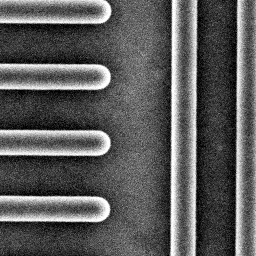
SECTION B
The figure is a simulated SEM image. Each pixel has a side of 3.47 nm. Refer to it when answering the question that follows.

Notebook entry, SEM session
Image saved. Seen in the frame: groups of lines, slits or small figures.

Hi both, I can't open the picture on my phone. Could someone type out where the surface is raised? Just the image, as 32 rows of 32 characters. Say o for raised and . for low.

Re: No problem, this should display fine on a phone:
oooooooooooooo........ooo.....oo
oooooooooooooo........ooo.....oo
ooooooooooooo.........ooo.....oo
......................ooo.....oo
......................ooo.....oo
......................ooo.....oo
......................ooo.....oo
......................ooo.....oo
ooooooooooooo.........ooo.....oo
oooooooooooooo........oo......oo
ooooooooooooo.........oo......oo
......................oo......oo
......................oo......oo
......................oo......oo
......................oo......oo
......................oo......oo
ooooooooooooo.........oo......oo
oooooooooooooo........oo......oo
oooooooooooooo........oo......oo
......................oo......oo
......................oo......oo
......................oo......oo
......................oo......oo
......................oo......oo
......................oo......oo
ooooooooooooo.........oo......oo
oooooooooooooo.......ooo......oo
ooooooooooooo........ooo......oo
.....................ooo......oo
.....................ooo......oo
.....................ooo......oo
.....................ooo......oo